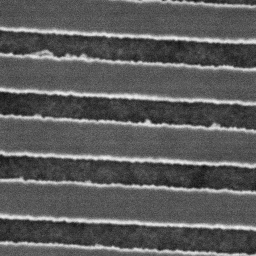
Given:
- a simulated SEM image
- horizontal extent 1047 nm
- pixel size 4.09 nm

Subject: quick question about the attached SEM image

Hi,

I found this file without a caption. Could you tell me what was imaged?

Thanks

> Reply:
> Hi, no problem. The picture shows lines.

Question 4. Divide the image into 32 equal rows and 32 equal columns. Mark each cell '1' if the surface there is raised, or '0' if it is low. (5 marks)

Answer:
11111111111111111111111111100000
11111111111111111111111111111111
11111111111111111111111111111111
11111111111111111111111111111111
00000000000001111111111111111111
00000000000000000000000000000000
00000000000000000000000000000000
11111111111111000000000000000000
11111111111111111111111111111100
11111111111111111111111111111111
11111111111111111111111111111111
01111111111111111111111111111111
00000000000000000001111111111111
00000000000000000000000000000000
11000000000000000000000000000000
11111111111111111110100000000000
11111111111111111111111111111111
11111111111111111111111111111111
11111111111111111111111111111111
00001111111111111111111111111111
00000000000000000000000001111111
00000000000000000000000000000000
11100000000000000000000000000000
11111111111111111111110000000000
11111111111111111111111111111111
11111111111111111111111111111111
11111111111111111111111111111111
00000011111111111111111111111111
00000000000000000000000000001111
00000000000000000000000000000000
11111100000000000000000000000000
11111111111111111111111000000000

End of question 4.